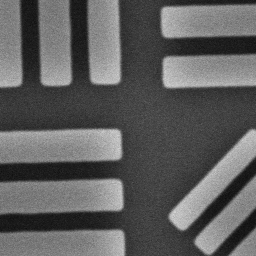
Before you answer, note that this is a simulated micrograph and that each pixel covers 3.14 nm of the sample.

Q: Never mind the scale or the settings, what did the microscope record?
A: groups of lines, slits or small figures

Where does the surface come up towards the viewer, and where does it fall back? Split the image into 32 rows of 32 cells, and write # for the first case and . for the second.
##...####..####.................
###..####..####.....############
###..####..####.....############
###..####..####.....############
###..####..####......#######....
###..####..####.................
###..####..####.................
###..####..####......###########
###..####..####.....############
###..####..####.....############
##....##.............###########
................................
................................
................................
................................
................................
.##############................#
###############...............##
###############..............###
###############.............####
...........................####.
..........................####..
............###..........####..#
###############.........####..##
###############........####...##
###############.......####...###
#####................####...###.
.....................###...###..
......................#...###...
###############..........####..#
################.........###..##
################.........##..###